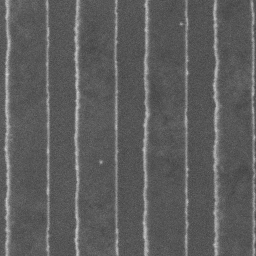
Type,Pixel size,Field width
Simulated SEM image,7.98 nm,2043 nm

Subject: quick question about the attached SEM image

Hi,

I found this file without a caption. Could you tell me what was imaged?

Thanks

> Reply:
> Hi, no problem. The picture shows lines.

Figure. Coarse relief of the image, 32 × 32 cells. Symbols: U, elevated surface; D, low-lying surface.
DUUUUUDDDDUUUUUDDDUUUUUDDDDUUUUU
DUUUUUDDDDUUUUUDDDUUUUUDDDDUUUUU
DUUUUUDDDDUUUUUDDDUUUUUDDDDUUUUU
DUUUUUDDDDUUUUUDDDUUUUUDDDDUUUUU
DUUUUUDDDDUUUUUDDDUUUUUDDDDUUUUU
DUUUUUDDDDUUUUUDDDUUUUUDDDDUUUUU
DUUUUUDDDDUUUUDDDDUUUUUDDDDUUUUU
DUUUUUDDDDUUUUDDDDUUUUUDDDDUUUUU
DUUUUUDDDDUUUUUDDDUUUUUDDDDUUUUU
DUUUUUDDDDUUUUUDDDUUUUUDDDDUUUUU
DUUUUUDDDDUUUUUDDDUUUUUDDDDUUUUU
DUUUUUDDDDUUUUUDDDUUUUUDDDDUUUUU
DUUUUUDDDDUUUUUDDDUUUUUDDDDUUUUU
DUUUUUDDDDUUUUUDDDUUUUUDDDDUUUUU
DUUUUUDDDDUUUUUDDDUUUUUDDDDUUUUU
DUUUUUDDDDUUUUUDDDUUUUUDDDDUUUUU
DUUUUUDDDDUUUUUDDDUUUUUDDDDUUUUU
DUUUUUDDDUUUUUUDDDUUUUUDDDDUUUUU
DUUUUUDDDDUUUUUDDDUUUUUDDDDUUUUU
DUUUUUDDDDUUUUUDDDUUUUUDDDDUUUUU
DUUUUUDDDDUUUUUDDDUUUUUDDDDUUUUU
DUUUUUDDDDUUUUUDDDUUUUUDDDDUUUUU
DUUUUUDDDDUUUUUDDDUUUUUDDDDUUUUU
DUUUUUDDDDUUUUUDDDUUUUUDDDDUUUUU
DUUUUUDDDDUUUUUDDDUUUUUDDDDUUUUU
DUUUUUDDDDUUUUUDDDUUUUUDDDDUUUUU
DUUUUUDDDDUUUUUDDDUUUUUDDDDUUUUU
DUUUUUDDDDUUUUUDDDUUUUUDDDDUUUUU
DUUUUUDDDDUUUUUDDDUUUUUDDDDUUUUU
DUUUUUDDDDUUUUUDDDUUUUUDDDDUUUUU
DUUUUUDDDDUUUUUDDDUUUUUDDDDUUUUU
DUUUUUDDDDUUUUUDDDUUUUUDDDDUUUUU